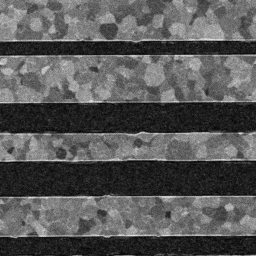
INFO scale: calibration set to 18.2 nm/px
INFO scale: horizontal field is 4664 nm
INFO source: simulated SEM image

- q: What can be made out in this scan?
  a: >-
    one or a few lines or trenches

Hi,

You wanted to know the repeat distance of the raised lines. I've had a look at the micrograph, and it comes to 1250 nanometers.